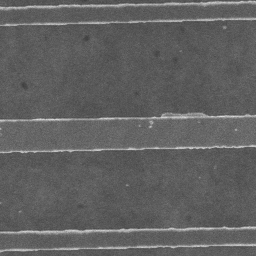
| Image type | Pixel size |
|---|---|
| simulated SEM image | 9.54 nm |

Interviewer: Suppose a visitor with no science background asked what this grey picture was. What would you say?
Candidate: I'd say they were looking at lines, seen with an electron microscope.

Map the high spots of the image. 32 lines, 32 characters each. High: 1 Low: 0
00000000000000000000111111111111
11111111111111111111111111111111
11111111111111111111111111100000
00000000000000000000000000000000
00000000000000000000000000000000
00000000000000000000000000000000
00000000000000000000000000000000
00000000000000000000000000000000
00000000000000000000000000000000
00000000000000000000000000000000
00000000000000000000000000000000
00000000000000000000000000000000
00000000000000000000000000000000
00000000000000000000000000000000
00000000000000000000000000000000
11111111111111111111111111111111
11111111111111111111111111111111
11111111111111111111111111111111
11111111111111111111111111000000
00000000000000000000000000000000
00000000000000000000000000000000
00000000000000000000000000000000
00000000000000000000000000000000
00000000000000000000000000000000
00000000000000000000000000000000
00000000000000000000000000000000
00000000000000000000000000000000
00000000000000000000000000000000
00000000000000000000000000011011
11111111111111111111111111111111
11111111111111111111111111111111
00000000000000000000000000000000